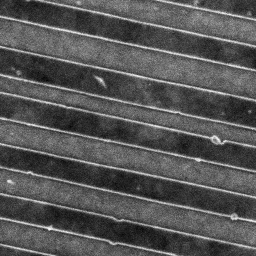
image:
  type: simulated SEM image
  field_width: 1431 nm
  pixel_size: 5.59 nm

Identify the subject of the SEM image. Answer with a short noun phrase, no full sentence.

parallel lines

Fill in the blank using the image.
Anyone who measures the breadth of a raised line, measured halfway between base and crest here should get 140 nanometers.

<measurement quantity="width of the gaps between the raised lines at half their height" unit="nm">140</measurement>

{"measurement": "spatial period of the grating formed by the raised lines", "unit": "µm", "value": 0.274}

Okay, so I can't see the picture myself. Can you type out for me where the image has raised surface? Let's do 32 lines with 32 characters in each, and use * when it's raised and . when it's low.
*******...............**********
************...............*****
..**************................
......***************...........
...........***************......
................***************.
***..................***********
********.................*******
*************.................**
******************..............
.....*****************..........
..........*****************.....
*****.........******************
*********..........*************
**************..........********
...***************...........***
........***************.........
.............**************.....
***..............***************
*******...............**********
************...............*****
...**************...............
.......***************..........
............**************......
**...............**************.
*******..............***********
***********...............******
.**************................*
......**************............
..........***************.......
...............***************..
*****...............************